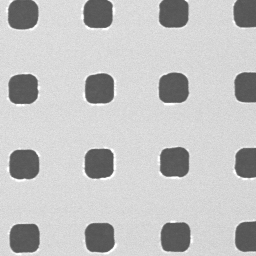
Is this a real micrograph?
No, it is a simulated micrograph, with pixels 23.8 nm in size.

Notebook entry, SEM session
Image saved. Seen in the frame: a regular array of holes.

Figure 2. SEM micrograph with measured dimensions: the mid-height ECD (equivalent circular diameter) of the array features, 767 nm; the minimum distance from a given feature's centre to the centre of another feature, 74.1 px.